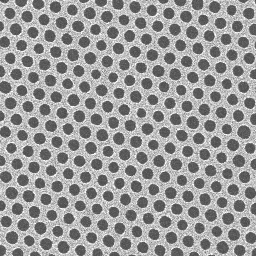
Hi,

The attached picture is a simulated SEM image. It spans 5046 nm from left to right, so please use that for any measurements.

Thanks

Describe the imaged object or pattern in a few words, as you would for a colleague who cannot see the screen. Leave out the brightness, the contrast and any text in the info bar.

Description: a regular array of holes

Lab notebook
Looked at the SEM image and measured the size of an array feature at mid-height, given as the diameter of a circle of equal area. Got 226 nm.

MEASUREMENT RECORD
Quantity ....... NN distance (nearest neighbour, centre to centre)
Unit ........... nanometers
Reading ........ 332